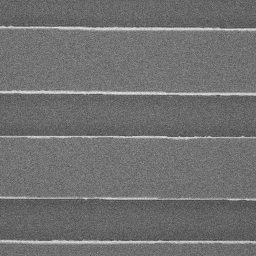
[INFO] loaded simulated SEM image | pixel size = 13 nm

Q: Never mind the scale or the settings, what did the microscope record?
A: lines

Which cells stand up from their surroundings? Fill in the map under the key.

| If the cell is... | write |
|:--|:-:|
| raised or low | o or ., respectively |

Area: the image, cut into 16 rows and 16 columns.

................
................
oooooooooooooooo
oooooooooooooooo
oooooooooooooooo
oooooooooooooooo
................
................
................
oooooooooooooooo
oooooooooooooooo
oooooooooooooooo
................
................
................
oooooooooooooooo